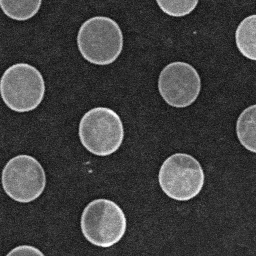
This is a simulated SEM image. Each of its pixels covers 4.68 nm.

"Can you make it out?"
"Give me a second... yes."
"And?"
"raised bodies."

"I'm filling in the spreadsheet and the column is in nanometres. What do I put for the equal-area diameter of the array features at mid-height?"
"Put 209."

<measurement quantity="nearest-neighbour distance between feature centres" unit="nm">424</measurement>